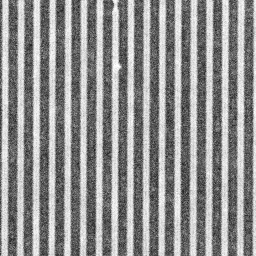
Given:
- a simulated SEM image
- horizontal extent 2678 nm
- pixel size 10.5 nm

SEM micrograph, parallel lines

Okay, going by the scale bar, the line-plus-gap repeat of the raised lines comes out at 164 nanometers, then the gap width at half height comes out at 116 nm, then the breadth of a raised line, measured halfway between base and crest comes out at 0.0536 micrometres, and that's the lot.